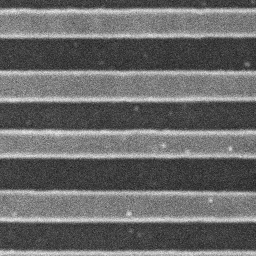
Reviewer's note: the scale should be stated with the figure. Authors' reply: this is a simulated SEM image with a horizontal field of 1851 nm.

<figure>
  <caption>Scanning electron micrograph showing lines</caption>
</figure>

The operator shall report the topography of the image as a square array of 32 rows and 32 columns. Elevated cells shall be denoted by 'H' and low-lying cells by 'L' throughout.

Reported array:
LLLLLLLLLLLLLLLLLLLLLLLLLLLLLLLL
HHHHHHHHHHHHHHHHHHHHHHHHHHHHHHHH
HHHHHHHHHHHHHHHHHHHHHHHHHHHHHHHH
HHHHHHHHHHHHHHHHHHHHHHHHHHHHHHHH
HHHHHHHHHHHHHHHHHHHHHHHHHHHHHHHH
LLLLLLLLLLLLLLLLLLLLLLLLLLLLLLLL
LLLLLLLLLLLLLLLLLLLLLLLLLLLLLLLL
LLLLLLLLLLLLLLLLLLLLLLLLLLLLLLLL
LLLLLLLLLLLLLLLLLLLLLLLLLLLLLLLL
HHHHHHHHHHHHHHHHHHHHHHHHHHHHHHHH
HHHHHHHHHHHHHHHHHHHHHHHHHHHHHHHH
HHHHHHHHHHHHHHHHHHHHHHHHHHHHHHHH
HHHHHHHHHHHHHHHHHHHHHHHHHHHLHLLL
LLLLLLLLLLLLLLLLLLLLLLLLLLLLLLLL
LLLLLLLLLLLLLLLLLLLLLLLLLLLLLLLL
LLLLLLLLLLLLLLLLLLLLLLLLLLLLLLLL
HHHHHHHHLLHHHHHHHHHHHHLLLLLLLLHH
HHHHHHHHHHHHHHHHHHHHHHHHHHHHHHHH
HHHHHHHHHHHHHHHHHHHHHHHHHHHHHHHH
HHHHHHHHHHHHHHHHHHHHHHHHHHHHHHHH
LLLLLLLLLLLLLLLLLLLLLLLLLLLLLLLL
LLLLLLLLLLLLLLLLLLLLLLLLLLLLLLLL
LLLLLLLLLLLLLLLLLLLLLLLLLLLLLLLL
LLLLLLLLLLLLLLLLLLLLLLLLLLLLLLLL
HHHHHHHHHHHHHHHHHHHHHHHHHHHHHHHH
HHHHHHHHHHHHHHHHHHHHHHHHHHHHHHHH
HHHHHHHHHHHHHHHHHHHHHHHHHHHHHHHH
HHHHHHHHHHHHHHHHHHHHHHHHHHHHHHHH
LLLLLLLLLLLLLLLLLLLLLLLLLLLLLLLL
LLLLLLLLLLLLLLLLLLLLLLLLLLLLLLLL
LLLLLLLLLLLLLLLLLLLLLLLLLLLLLLLL
HHLLHLLLLLLHHLLLLLLHHHLLLLLLLLLL